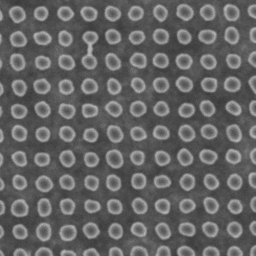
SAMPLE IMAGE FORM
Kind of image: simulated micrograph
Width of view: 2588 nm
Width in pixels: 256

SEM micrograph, a regular array of raised bodies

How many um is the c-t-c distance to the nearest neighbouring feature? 0.233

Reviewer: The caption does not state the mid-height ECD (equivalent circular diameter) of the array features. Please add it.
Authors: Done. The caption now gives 152 nm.